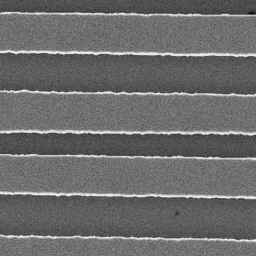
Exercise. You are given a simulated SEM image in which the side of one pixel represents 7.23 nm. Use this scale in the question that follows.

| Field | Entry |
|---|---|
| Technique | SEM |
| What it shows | lines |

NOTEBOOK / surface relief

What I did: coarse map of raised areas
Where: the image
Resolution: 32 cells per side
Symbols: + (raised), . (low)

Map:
................................
................................
++++++++++++++++++++++++++++++++
++++++++++++++++++++++++++++++++
++++++++++++++++++++++++++++++++
++++++++++++++++++++++++++++++++
++++++++++++++++++++++++++++++++
................................
................................
................................
................................
+++++...........................
++++++++++++++++++++++++++++++++
++++++++++++++++++++++++++++++++
++++++++++++++++++++++++++++++++
++++++++++++++++++++++++++++++++
++++++++++++++++++++++++++++++++
................................
................................
++++++++++++++..................
++++++++++++++++++++++++++++++++
++++++++++++++++++++++++++++++++
++++++++++++++++++++++++++++++++
++++++++++++++++++++++++++++++++
...............+++..++++++++++++
................................
................................
................................
................................
+...............................
++++++++++++++++++++++++++++++++
++++++++++++++++++++++++++++++++